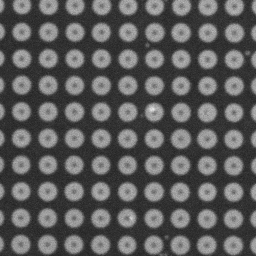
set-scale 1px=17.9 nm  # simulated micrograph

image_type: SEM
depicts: an array of small figures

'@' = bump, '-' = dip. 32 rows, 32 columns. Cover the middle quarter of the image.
--@@----@@@---@@@----@@@----@@@-
--------------------------------
--------------------------------
-@@@----@@@----@@----@@@----@@--
-@@@@--@@@@---@@@@---@@@@--@@@@-
@@@@@--@@@@@--@@@@--@@@@@--@@@@-
-@@@@--@@@@---@@@@---@@@@--@@@@-
--@-----@@-----@@-----@@----@@--
--------------------------------
--------------------------------
-@@@----@@@---@@@@---@@@----@@@-
@@@@@--@@@@---@@@@--@@@@@--@@@@-
@@@@@--@@@@---@@@@--@@@@@--@@@@-
-@@@----@@@---@@@@---@@@---@@@@-
--------------------------------
--------------------------------
--@------@-----@@-----@------@--
-@@@@--@@@@---@@@@---@@@---@@@@-
@@@@@--@@@@@--@@@@--@@@@@--@@@@@
@@@@@--@@@@---@@@@--@@@@@--@@@@@
-@@@----@@@---@@@----@@@----@@@-
--------------------------------
--------------------------------
-@@@----@@@---@@@----@@@----@@@-
@@@@@--@@@@---@@@@--@@@@@--@@@@-
@@@@@--@@@@---@@@@--@@@@@--@@@@-
-@@@---@@@@---@@@@---@@@@--@@@@-
---------------@@-----@-----@@--
--------------------------------
--------------------------------
-@@@---@@@@---@@@@---@@@---@@@@-
@@@@@--@@@@---@@@@--@@@@@--@@@@-